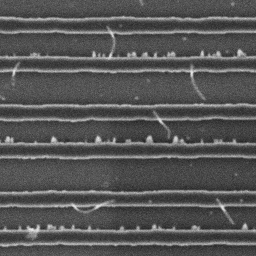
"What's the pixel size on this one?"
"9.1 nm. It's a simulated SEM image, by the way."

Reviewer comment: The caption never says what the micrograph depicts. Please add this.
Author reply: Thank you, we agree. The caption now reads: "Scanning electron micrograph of lines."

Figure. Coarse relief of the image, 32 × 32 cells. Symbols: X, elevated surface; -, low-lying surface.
--------------------------------
--------------------------------
XXXXXXXXXXXXXXXXXXXXXXXXXXXXXXXX
XXXXXXXXXXXXXXXXXXXXXXXXXXXXXXXX
--------------------------------
--------------------------------
--------------------------------
XXXXXXXXXXXXXXXXXXXXXXXXXXXXXXXX
XXXXXXXXXXXXXXXXXXXXXXXXXXXXXXXX
--------------------------------
--------------------------------
--------------------------------
--------------------------------
XXXXXXXXXXXXXXXXXXXXXXXXXXXXXXXX
XXXXXXXXXXXXXXXXXXXXXXXXXXXXXXXX
--------------------------------
--------------------------------
--------------------------------
XXXXXXXXXXXXXXXXXXXXXXXXXXXXXXXX
XXXXXXXXXXXXXXXXXXXXXXXXXXXXXXXX
--------------------------------
--------------------------------
--------------------------------
--------------------------------
XXXXXXXXXXXXXXXXXXXXXXXXXXXXXXXX
XXXXXXXXXXXXXXXXXXXXXXXXXXXXXXXX
--------------------------------
--------------------------------
--------------------------------
XXXXXXXXXXXXXXXXXXXXXXXXXXXXXXXX
XXXXXXXXXXXXXXXXXXXXXXXXXXX-XXXX
--------------------------------